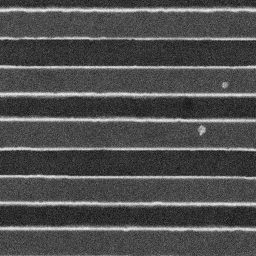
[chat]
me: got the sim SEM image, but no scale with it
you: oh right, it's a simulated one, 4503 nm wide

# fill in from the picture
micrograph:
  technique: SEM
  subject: lines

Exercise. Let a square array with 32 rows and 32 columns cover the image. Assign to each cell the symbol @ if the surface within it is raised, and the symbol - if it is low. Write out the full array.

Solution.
--------------------------------
@@@@@@@@@@@@@@@@@@@@@@@@@@@@@@@@
@@@@@@@@@@@@@@@@@@@@@@@@@@@@@@@@
@@@@@@@@@@@@@@@@@@@@@@@@@@@@@@@@
@@@@@@@@@@@@@@@@@@@@@@@@@@@@@@@@
--------------------------------
--------------------------------
--------------------------------
@@@@@@@@@@@@@@@@@@@@@@@@@@@@@@@@
@@@@@@@@@@@@@@@@@@@@@@@@@@@@@@@@
@@@@@@@@@@@@@@@@@@@@@@@@@@@@@@@@
@@@@@@@@@@@@@@@@@@@@@@@@@@@@@@@@
--------------------------------
--------------------------------
--------------------------------
@@@@@@@@@@@@@@@@@@@@@@@@@@@@@@@@
@@@@@@@@@@@@@@@@@@@@@@@@@@@@@@@@
@@@@@@@@@@@@@@@@@@@@@@@@@@@@@@@@
@@@@@@@@@@@@@@@@@@@@@@@@@@@@@@@@
--------------------------------
--------------------------------
--------------------------------
@@@@@@@@@@@@@@@@@@@@@@@@@@@@@@@@
@@@@@@@@@@@@@@@@@@@@@@@@@@@@@@@@
@@@@@@@@@@@@@@@@@@@@@@@@@@@@@@@@
--------------------------------
--------------------------------
--------------------------------
--------------------------------
@@@@@@@@@@@@@@@@@@@@@@@@@@@@@@@@
@@@@@@@@@@@@@@@@@@@@@@@@@@@@@@@@
@@@@@@@@@@@@@@@@@@@@@@@@@@@@@@@@